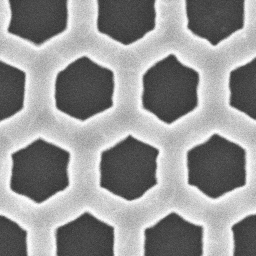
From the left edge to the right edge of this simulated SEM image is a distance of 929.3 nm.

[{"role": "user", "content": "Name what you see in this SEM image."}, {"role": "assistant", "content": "holes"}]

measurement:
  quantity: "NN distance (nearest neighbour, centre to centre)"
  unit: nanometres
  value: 320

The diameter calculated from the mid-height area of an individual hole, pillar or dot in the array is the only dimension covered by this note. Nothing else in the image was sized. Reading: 223 nm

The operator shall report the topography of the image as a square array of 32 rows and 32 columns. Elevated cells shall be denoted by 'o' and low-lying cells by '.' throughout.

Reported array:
o.......oooo.......oooo........o
o.......oooo........ooo........o
o........ooo.......oooo........o
o.......oooo.......ooooo......oo
oo.....oooooo.....ooooooo....ooo
oooo.oooooooooo.oooooooooo.ooooo
oooooooooooooooooooooooooooooooo
ooooooooo..ooooooooo..ooooooooo.
..oooooo.....oooooo.....ooooo...
...oooo.......oooo.......oooo...
...oooo.......oooo.......ooo....
...oooo.......oooo.......oooo...
...oooo.......oooo.......oooo...
...oooo.......oooo......ooooo...
..ooooooo...ooooooo....oooooooo.
oooooooooooooooooooooooooooooooo
oooooooooooooooooooooooooooooooo
oooo..ooooooooo..ooooooooo...ooo
ooo.....oooooo......oooo......oo
o........oooo.......ooo........o
oo.......ooo........ooo........o
o.......oooo........ooo........o
o........ooo........ooo........o
o.......ooooo......oooooo.....oo
ooo...ooooooooo...oooooooo..oooo
oooooooooooooooooooooooooooooooo
oooooooooooooooooooooooooooooooo
..ooooooo....ooooooo...ooooooo..
...oooo.......oooo.......oooo...
...oooo.......oooo.......oooo...
...oooo.......oooo........ooo...
....ooo.......oooo.......oooo...